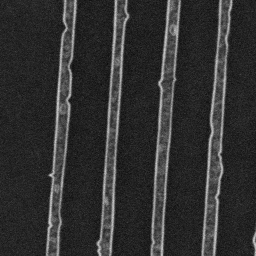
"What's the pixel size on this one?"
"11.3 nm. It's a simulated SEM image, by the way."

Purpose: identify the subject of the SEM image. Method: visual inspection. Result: parallel lines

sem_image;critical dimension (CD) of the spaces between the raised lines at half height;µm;0.468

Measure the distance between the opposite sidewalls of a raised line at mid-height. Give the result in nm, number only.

124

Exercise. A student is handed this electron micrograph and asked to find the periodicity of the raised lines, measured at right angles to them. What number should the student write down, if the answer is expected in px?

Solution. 51.7